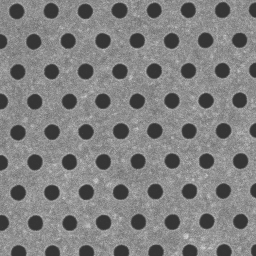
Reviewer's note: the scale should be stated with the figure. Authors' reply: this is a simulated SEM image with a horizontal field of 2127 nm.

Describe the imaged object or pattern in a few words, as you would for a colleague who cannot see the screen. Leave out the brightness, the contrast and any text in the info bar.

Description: a regular array of holes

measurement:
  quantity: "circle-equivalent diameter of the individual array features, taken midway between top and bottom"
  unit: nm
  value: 131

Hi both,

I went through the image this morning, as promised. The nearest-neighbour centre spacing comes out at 0.282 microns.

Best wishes